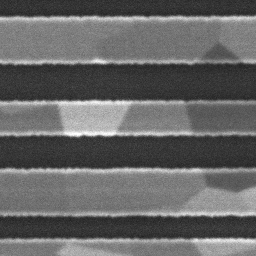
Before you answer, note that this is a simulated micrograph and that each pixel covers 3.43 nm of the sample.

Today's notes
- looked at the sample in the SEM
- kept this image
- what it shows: lines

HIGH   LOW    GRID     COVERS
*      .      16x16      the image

................
****************
****************
****************
................
................
****************
****************
................
................
................
****************
****************
................
................
****************